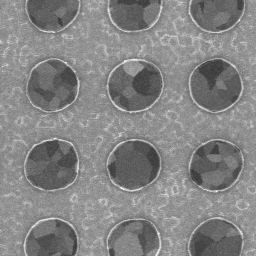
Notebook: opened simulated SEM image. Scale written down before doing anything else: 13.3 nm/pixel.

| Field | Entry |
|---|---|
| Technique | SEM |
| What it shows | raised bodies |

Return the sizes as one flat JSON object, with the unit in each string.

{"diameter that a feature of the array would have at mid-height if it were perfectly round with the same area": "704 nm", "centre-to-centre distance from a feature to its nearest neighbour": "1060 nm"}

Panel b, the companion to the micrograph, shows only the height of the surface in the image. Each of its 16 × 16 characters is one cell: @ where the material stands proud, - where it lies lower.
--@@@--@@@--@@@-
--@@---@@@--@@@-
----------------
----------------
--@@@--@@@--@@@-
--@@@--@@@--@@@-
--@@---@@@--@@@-
----------------
----------------
--@@@--@@@--@@@-
--@@@--@@@--@@@-
--@@---@@---@@--
----------------
----------------
--@@@--@@@--@@@-
--@@@--@@@--@@@-